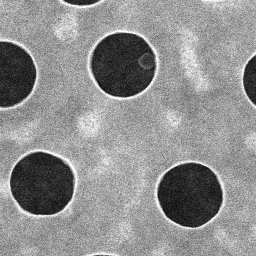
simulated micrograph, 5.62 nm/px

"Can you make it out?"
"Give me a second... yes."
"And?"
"holes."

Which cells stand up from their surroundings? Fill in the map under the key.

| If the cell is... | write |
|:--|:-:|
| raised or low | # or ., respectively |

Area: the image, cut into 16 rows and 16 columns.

################
################
######...#######
..####....######
..####....#####.
..####...######.
.###############
################
################
################
#...#######..###
#....#####....##
#...######....##
##########...###
################
################